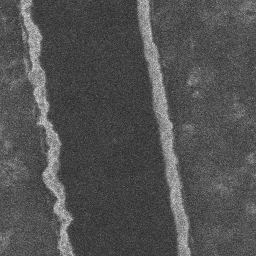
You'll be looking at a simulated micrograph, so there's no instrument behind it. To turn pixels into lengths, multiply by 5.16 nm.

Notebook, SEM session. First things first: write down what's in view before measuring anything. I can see one or a few lines or trenches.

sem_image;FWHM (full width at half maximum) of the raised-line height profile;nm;608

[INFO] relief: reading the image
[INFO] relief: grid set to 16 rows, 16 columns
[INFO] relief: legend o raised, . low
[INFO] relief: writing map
.oooooooo.......
..ooooooo.......
..ooooooo.......
..oooooooo......
..oooooooo......
..oooooooo......
...ooooooo......
...ooooooo......
...ooooooo......
...oooooooo.....
...oooooooo.....
...oooooooo.....
....ooooooo.....
....ooooooo.....
....oooooooo....
....oooooooo....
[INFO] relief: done